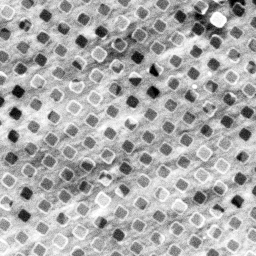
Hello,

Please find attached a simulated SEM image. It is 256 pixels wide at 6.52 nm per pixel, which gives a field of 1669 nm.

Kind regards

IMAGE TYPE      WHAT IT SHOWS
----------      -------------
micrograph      a regular array of raised bodies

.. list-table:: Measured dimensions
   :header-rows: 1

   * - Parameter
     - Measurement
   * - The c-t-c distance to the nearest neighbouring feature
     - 143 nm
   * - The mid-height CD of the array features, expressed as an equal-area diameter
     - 89.7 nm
